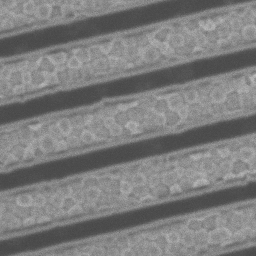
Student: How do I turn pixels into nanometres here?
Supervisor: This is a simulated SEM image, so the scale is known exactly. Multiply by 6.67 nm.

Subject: one or a few lines or trenches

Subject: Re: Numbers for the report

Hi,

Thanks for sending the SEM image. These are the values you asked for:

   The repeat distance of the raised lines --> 434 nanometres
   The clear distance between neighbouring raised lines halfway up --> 273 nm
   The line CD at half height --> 158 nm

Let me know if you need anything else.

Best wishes